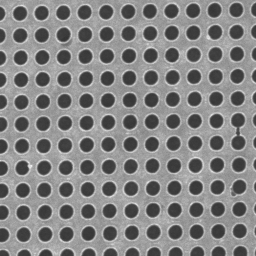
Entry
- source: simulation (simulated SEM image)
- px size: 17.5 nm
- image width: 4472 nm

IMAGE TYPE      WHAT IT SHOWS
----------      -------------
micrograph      a regular array of holes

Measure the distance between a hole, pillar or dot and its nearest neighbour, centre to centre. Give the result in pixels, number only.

21.5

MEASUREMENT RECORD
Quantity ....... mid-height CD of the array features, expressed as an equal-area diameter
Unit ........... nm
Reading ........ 248